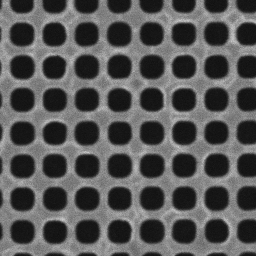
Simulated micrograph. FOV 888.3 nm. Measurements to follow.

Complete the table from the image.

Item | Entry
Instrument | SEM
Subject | a regular array of holes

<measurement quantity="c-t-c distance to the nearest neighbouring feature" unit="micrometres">0.112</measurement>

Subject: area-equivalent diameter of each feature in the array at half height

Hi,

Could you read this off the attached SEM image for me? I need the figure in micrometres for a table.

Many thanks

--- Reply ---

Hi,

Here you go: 0.0871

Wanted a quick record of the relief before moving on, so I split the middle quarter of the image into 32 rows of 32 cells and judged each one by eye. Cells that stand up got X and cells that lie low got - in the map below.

XXX------XX------XX------XX-----
-XX------XX------XX------XX-----
XXX-----XXX------XX------XX-----
XXXX----XXXX----XXXX---XXXXXX--X
XXXXXXXXXXXXXXXXXXXXXXXXXXXXXXXX
XXXXXXXXXXXXXXXXXXXXXXXXXXXXXXXX
XXXX----XXXX----XXXX----XXXX----
XXX------XX------XX------XX-----
-XX------XX------XX------XX-----
-XX------XX------XX------XX-----
XXX------XX------XX------XX-----
XXXX----XXXX----XXXX----XXXX----
XXXXXXXXXXXXXXXXXXXXXXXXXXXXXXXX
XXXXXXXXXXXXXXXXXXXXXXXXXXXXXXXX
XXXX---XXXXX----XXXX---XXXXX----
XXX-----XXX------XX------XX-----
-XX------XX------XX------XX-----
-XX------XX------XX------XX-----
-XX------XX------XX------XX-----
XXX-----XXXX----XXXX----XXXX----
XXXXXXXXXXXXXXXXXXXXXXXXXXXXXXXX
XXXXXXXXXXXXXXXXXXXXXXXXXXXXXXXX
XXXXX--XXXXXX--XXXXXX--XXXXXX--X
XXX-----XXX------XX------XX-----
-XX------XX------XX------XX-----
-XX------XX------XX------XX-----
-XX------XX------XX------XX-----
XXX-----XXX-----XXXX-----XXX----
XXXXX--XXXXXX--XXXXXX--XXXXXX-XX
XXXXXXXXXXXXXXXXXXXXXXXXXXXXXXXX
XXXXXXXXXXXXXXXXXXXXX--XXXXXXX-X
XXX-----XXX-----XXXX----XXXX----